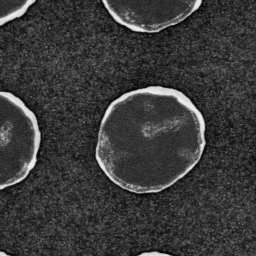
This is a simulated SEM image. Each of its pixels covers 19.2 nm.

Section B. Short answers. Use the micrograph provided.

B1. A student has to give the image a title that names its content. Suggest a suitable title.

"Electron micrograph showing raised bodies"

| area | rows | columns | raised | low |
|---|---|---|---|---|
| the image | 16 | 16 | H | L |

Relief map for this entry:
HHLLLLLHHHHHLLLL
LLLLLLLLHHHLLLLL
LLLLLLLLLLLLLLLL
LLLLLLLLLLLLLLLL
LLLLLLLLLLLLLLLL
LLLLLLLLLHLLLLLL
HLLLLLLHHHHHLLLL
HHLLLLHHHHHHHLLL
HHLLLLHHHHHHHLLL
HHLLLLHHHHHHHLLL
HHLLLLHHHHHHLLLL
HLLLLLLHHHHLLLLL
LLLLLLLLLLLLLLLL
LLLLLLLLLLLLLLLL
LLLLLLLLLLLLLLLL
LLLLLLLLLLLLLLLL